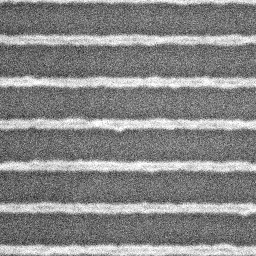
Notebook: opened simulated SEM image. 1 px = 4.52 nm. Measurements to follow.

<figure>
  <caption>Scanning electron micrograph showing parallel lines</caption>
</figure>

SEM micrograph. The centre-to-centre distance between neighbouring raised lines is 190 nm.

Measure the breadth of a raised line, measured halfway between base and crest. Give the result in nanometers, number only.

28.2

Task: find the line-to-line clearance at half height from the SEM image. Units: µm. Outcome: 0.16